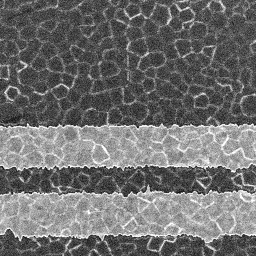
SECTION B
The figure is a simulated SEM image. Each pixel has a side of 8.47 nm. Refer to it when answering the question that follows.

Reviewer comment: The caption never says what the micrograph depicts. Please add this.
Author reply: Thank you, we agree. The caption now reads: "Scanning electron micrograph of one or a few lines or trenches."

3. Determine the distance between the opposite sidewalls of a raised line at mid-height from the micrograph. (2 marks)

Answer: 336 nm